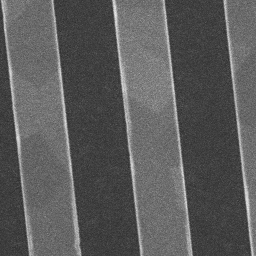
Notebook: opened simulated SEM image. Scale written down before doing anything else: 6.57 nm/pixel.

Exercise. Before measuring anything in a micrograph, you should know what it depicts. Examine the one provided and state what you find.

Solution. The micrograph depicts one or a few lines or trenches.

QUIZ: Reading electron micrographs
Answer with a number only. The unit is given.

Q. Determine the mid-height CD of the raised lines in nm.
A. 334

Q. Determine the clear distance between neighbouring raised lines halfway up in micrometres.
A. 0.392